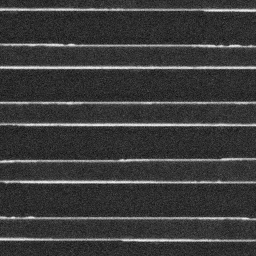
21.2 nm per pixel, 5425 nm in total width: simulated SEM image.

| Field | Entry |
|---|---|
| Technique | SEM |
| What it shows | lines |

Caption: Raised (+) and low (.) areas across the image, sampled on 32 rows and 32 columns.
++++++++++++++++++++++++++++++++
................................
................................
................................
................................
................................
++++++++++++++++++++++++++++++++
++++++++++++++++++++++++++++++++
................................
................................
................................
................................
................................
++++++++++++++++++++++++++++++++
++++++++++++++++++++++++++++++++
++++++++++++++++++++++++++++++++
................................
................................
................................
................................
++++++++++++++++++++++++++++++++
++++++++++++++++++++++++++++++++
++++++++++++++++++++++++++++++++
................................
................................
................................
................................
++++++++++++++++++++++++++++++++
++++++++++++++++++++++++++++++++
++++++++++++++++++++++++++++++++
................................
................................